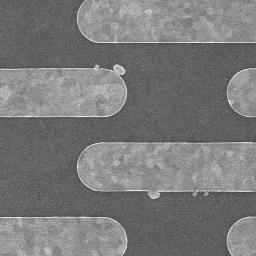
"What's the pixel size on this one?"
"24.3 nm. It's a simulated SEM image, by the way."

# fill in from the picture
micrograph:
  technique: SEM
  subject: groups of lines, slits or small figures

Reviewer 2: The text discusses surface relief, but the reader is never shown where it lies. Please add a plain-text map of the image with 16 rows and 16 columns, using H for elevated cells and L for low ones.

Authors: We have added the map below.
LLLLLHHHHHHHHHHH
LLLLLHHHHHHHHHHH
LLLLLLHHHHHHHHHH
LLLLLLLLLLLLLLLL
HHHHHHHHLLLLLLLH
HHHHHHHHLLLLLLHH
HHHHHHHHLLLLLLHH
LLLLLLLLLLLLLLLL
LLLLLLLLLLLLLLLL
LLLLLHHHHHHHHHHH
LLLLLHHHHHHHHHHH
LLLLLHHHHHHHHHHH
LLLLLLLLLLLLLLLL
LLLLLLLLLLLLLLLL
HHHHHHHHLLLLLLHH
HHHHHHHHLLLLLLHH